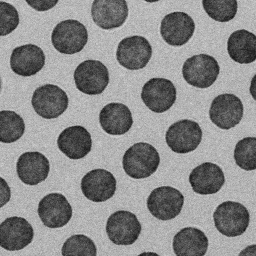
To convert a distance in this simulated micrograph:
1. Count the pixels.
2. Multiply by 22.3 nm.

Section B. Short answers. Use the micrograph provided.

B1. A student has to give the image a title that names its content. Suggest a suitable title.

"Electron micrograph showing a regular array of holes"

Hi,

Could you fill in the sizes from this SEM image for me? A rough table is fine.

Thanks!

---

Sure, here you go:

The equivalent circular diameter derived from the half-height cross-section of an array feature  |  35.1 pixels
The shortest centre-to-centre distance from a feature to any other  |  1070 nm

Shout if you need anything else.